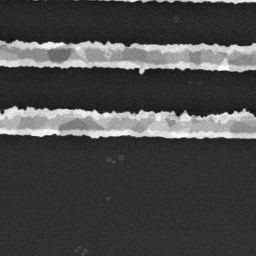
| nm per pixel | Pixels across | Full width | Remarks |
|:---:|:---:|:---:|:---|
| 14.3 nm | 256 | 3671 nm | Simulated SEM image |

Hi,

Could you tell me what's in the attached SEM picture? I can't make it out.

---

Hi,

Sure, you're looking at one or a few lines or trenches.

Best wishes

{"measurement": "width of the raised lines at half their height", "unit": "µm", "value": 0.292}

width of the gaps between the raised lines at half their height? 0.679 microns